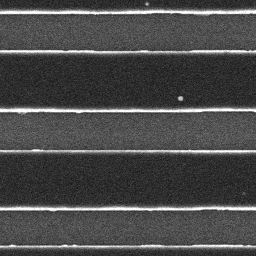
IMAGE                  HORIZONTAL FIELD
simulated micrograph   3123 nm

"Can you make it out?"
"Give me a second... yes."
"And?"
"lines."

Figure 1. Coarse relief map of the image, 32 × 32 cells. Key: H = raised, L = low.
HHHHHHHHHHHHHHHHHHHHHHHHHHHHHHHH
HHHHHHHHHHHHHHHHHHHHHHHHHHHHHHHH
LLLLLLLLLLLLLLLLLLLLLLLLLLLLLLLL
LLLLLLLLLLLLLLLLLLLLLLLLLLLLLLLL
LLLLLLLLLLLLLLLLLLLLLLLLLLLLLLLL
LLLLLLLLLLLLLLLLLLLLLLLLLLLLLLLL
HHHHHHHHHHHHHHHHHHHHHHHHHHHHHHHH
HHHHHHHHHHHHHHHHHHHHHHHHHHHHHHHH
HHHHHHHHHHHHHHHHHHHHHHHHHHHHHHHH
HHHHHHHHHHHHHHHHHHHHHHHHHHHHHHHH
HHHHHHHHHHHHHHHHHHHHHHHHHHHHHHHH
HHHHHHHHHHHHHHHHHHHHHHHHHHHHHHHH
HHHHHHHHHHHHHHHHHHHHHHHHHHHHHHHH
HHHHHHHHHHHHHHHHHHHHHHHHHHHHHHHH
LLLLLLLLLLLLLLLLLLLLLLLLLLLLLLLL
LLLLLLLLLLLLLLLLLLLLLLLLLLLLLLLL
LLLLLLLLLLLLLLLLLLLLLLLLLLLLLLLL
LLLLLLLLLLLLLLLLLLLLLLLLLLLLLLLL
LLLLLLLLLLLLLLLLLLLLLLLLLLLLLLLL
HHHHHHHHHHHHHHHHHHHHHHHHHHHHHHHH
HHHHHHHHHHHHHHHHHHHHHHHHHHHHHHHH
HHHHHHHHHHHHHHHHHHHHHHHHHHHHHHHH
HHHHHHHHHHHHHHHHHHHHHHHHHHHHHHHH
HHHHHHHHHHHHHHHHHHHHHHHHHHHHHHHH
HHHHHHHHHHHHHHHHHHHHHHHHHHHHHHHH
HHHHHHHHHHHHHHHHHHHHHHHHHHHHHHHH
LLLLLLLLLLLLLLLLLLLLLLLLLLLLLLLL
LLLLLLLLLLLLLLLLLLLLLLLLLLLLLLLL
LLLLLLLLLLLLLLLLLLLLLLLLLLLLLLLL
LLLLLLLLLLLLLLLLLLLLLLLLLLLLLLLL
LLLLLLLLLLLLLLLLLLLLLLLLLLLLLLLL
HHHHHHHHHHHHHHHHHHHHHHHHHHHHHHHH